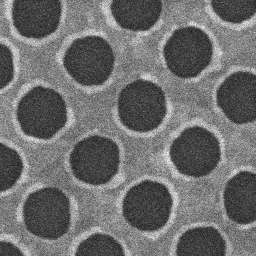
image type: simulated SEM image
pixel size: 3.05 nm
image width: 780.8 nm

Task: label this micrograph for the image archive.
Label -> a regular array of holes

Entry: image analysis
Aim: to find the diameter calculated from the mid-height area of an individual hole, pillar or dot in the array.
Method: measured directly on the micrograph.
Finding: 157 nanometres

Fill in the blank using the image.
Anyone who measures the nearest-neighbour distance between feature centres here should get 214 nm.